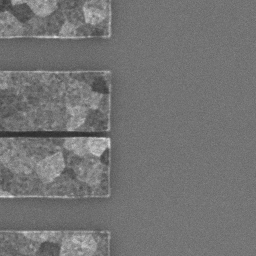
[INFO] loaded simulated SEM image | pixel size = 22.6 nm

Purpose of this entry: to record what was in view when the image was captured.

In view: wiring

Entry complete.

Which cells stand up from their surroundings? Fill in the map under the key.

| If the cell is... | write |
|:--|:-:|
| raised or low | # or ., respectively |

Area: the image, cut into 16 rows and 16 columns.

#######.........
#######.........
................
................
###.##..........
#######.........
#######.........
#######.........
######..........
#######.........
#######.........
#######.........
................
................
#...............
#######.........